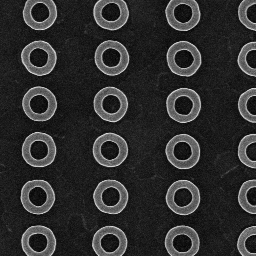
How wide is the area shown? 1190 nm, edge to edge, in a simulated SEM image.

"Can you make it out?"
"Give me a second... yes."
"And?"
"a regular array of ring-shaped raised bodies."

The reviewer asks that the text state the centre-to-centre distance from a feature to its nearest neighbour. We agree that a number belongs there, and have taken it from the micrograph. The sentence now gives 214 nanometers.